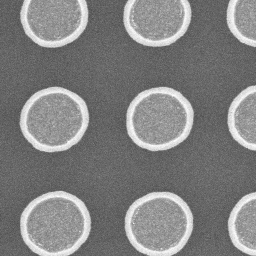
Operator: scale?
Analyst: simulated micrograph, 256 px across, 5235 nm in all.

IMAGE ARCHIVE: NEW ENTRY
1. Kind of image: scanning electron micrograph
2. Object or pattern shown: raised bodies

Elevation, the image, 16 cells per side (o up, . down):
..ooo...oooo..oo
..ooo...oooo..oo
..oo.....oo....o
................
................
................
..ooo...oooo...o
.oooo...oooo..oo
..ooo...ooo....o
................
................
................
..ooo....oo....o
..ooo...oooo...o
..ooo...oooo...o
..ooo....oo....o